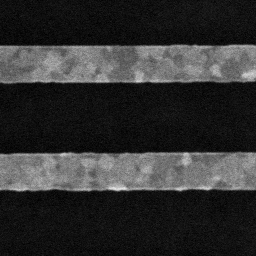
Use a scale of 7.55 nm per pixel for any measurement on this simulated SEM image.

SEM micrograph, lines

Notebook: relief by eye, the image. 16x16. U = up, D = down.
DDDDDDDDDDDDDDDD
DDDDDDDDDDDDDDDD
DDDDDDDDDDDDDDDD
UUUUUUUUUUUUUUUU
UUUUUUUUUUUUUUUU
DDDDDDDDDDDDDDDD
DDDDDDDDDDDDDDDD
DDDDDDDDDDDDDDDD
DDDDDDDDDDDDDDDD
DDDDDDDDDDDDDDDD
UUUUUUUUUUUUUUUU
UUUUUUUUUUUUUUUU
DDDDDDDDDDDDDDDD
DDDDDDDDDDDDDDDD
DDDDDDDDDDDDDDDD
DDDDDDDDDDDDDDDD